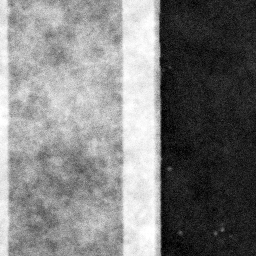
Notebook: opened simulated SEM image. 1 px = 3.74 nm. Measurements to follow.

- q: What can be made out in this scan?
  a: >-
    one or a few lines or trenches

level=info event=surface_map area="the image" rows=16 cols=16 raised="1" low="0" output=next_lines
1111111110000000
1111111110000000
1111111110000000
1111111110000000
1111111110000000
1111111110000000
1111111110000000
1111111110000000
1111111110000000
1111111110000000
1111111110000000
1111111110000000
1111111110000000
1111111110000000
1111111110000000
1111111110000000